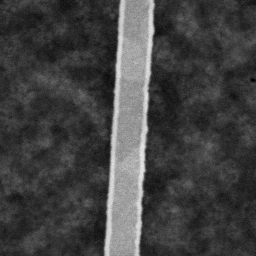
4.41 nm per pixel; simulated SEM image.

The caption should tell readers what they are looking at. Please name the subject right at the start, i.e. one or a few lines or trenches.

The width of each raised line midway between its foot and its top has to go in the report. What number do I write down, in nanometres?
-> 132